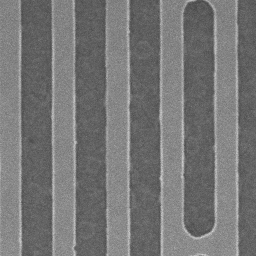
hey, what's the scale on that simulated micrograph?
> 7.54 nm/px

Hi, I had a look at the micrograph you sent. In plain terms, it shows parallel lines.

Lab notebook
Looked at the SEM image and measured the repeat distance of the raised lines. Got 54.1 pixels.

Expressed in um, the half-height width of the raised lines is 0.164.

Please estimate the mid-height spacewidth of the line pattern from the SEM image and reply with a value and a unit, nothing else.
0.241 µm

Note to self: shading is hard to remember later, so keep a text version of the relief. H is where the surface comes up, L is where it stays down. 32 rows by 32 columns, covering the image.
HHHLLLLHHLLLLHHHLLLLHHHLLLHHHHLL
HHHLLLLHHLLLLHHHLLLLHHHLLLLHHHLL
HHHLLLLHHLLLLHHHLLLLHHHLLLLHHHLL
HHHLLLLHHLLLLHHHLLLLHHHLLLLHHHLL
HHHLLLLHHLLLLHHHLLLLHHHLLLLHHHLL
HHHLLLLHHLLLLHHHLLLLHHHLLLLHHLLL
HHHLLLLHHLLLLHHHLLLLHHHLLLLHHHLL
HHHLLLLHHLLLLHHHLLLLHHHLLLLHHHLL
HHLLLLLHHLLLLHHHLLLLHHHLLLLHHHLL
HHLLLLLHHLLLLHHHLLLLHHHLLLLHHHLL
HHLLLLLHHLLLLHHHLLLLHHHLLLLHHHLL
HHHLLLLHHLLLLHHHLLLLHHHLLLLHHHLL
HHHLLLLHHLLLLHHHLLLLHHHLLLLHHHLL
HHLLLLLHHLLLLHHHLLLLHHHLLLLHHHLL
HHLLLLLHHLLLLHHHLLLLHHHLLLLHHHLL
HHHLLLLHHLLLLHHHLLLLHHHLLLLHHHLL
HHHLLLLHHLLLLHHHLLLLHHHLLLLHHHLL
HHHLLLLHHLLLLHHHLLLLHHHLLLLHHHLL
HHHLLLLHHLLLLHHHLLLLHHHLLLLHHHLL
HHHLLLLHHLLLLHHHLLLLHHHLLLLHHHLL
HHHLLLLHHLLLLHHHLLLLHHHLLLLHHHLL
HHHLLLLHHLLLLHHHLLLLHHHLLLLHHHLL
HHHLLLLHHLLLLHHHLLLLHHHLLLLHHHLL
HHLLLLLHHLLLLHHHLLLLHHHLLLLHHHLL
HHLLLLLHHLLLLHHHLLLLHHHLLLLHHHLL
HHLLLLLHHLLLLHHHLLLLHHHLLLLHHHLL
HHLLLLLHHLLLLHHHLLLLHHHLLLLHHHLL
HHHLLLLHHLLLLHHHLLLLHHHLLLLHHHLL
HHHLLLLHHLLLLHHHLLLLHHHLLLLHHHLL
HHLLLLLHHLLLLHHHLLLLHHHHLHHHHHLL
HHHLLLLHHLLLLHHHLLLLHHHHHHHHHHLL
HHHLLLLHHLLLLHHHLLLLHHHHHHHHHHLL